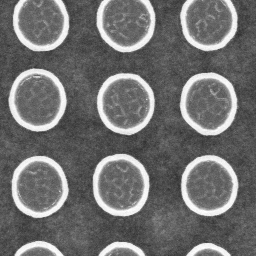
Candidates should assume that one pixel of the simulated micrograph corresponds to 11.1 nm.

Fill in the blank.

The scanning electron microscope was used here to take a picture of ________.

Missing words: raised bodies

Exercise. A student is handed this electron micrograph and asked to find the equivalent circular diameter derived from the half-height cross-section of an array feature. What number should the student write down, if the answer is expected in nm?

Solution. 605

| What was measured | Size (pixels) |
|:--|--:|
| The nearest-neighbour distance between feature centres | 82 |